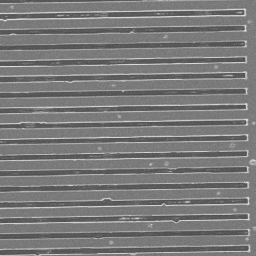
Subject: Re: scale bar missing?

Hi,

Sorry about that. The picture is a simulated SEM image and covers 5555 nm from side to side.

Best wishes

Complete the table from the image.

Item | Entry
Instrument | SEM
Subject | parallel lines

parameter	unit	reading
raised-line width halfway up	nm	217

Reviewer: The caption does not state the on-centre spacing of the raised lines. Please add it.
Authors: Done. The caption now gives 341 nanometers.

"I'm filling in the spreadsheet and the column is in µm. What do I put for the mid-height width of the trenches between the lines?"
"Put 0.119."